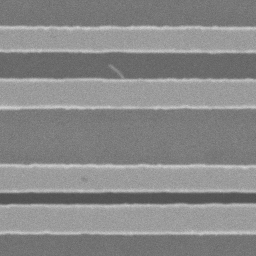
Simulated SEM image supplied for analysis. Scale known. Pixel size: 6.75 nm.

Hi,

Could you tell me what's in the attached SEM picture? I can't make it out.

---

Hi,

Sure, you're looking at lines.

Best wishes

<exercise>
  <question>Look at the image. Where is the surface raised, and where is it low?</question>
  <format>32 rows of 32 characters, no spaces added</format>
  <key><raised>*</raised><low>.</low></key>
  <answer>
................................
................................
................................
********************************
********************************
********************************
*****...******.*****************
................................
................................
................................
********************************
********************************
********************************
********************************
................................
................................
................................
................................
................................
................................
................................
********************************
********************************
********************************
................................
...............**....***.*******
********************************
********************************
********************************
................................
................................
................................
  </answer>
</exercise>